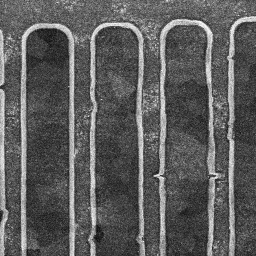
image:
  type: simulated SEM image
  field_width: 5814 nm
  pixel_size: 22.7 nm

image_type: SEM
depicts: one or a few lines or trenches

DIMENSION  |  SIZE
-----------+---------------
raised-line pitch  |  1580 nm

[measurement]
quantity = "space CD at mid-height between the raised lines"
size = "485 nm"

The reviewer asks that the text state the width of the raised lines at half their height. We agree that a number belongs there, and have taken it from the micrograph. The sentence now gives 1100 nm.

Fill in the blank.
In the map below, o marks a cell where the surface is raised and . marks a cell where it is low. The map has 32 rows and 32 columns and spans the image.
................................
................................
..............................oo
....oooo....ooooo....ooooo...ooo
...oooooo...ooooo...oooooo...ooo
...oooooo...oooooo..oooooo...ooo
...oooooo...oooooo..oooooo...ooo
...oooooo...oooooo..oooooo...ooo
...oooooo...oooooo..oooooo...ooo
...oooooo...oooooo..oooooo...ooo
...oooooo...ooooo...oooooo...ooo
...oooooo...ooooo...oooooo...ooo
...oooooo...ooooo...oooooo...ooo
...oooooo...ooooo...oooooo...ooo
...oooooo...ooooo...oooooo...ooo
...oooooo...ooooo...oooooo...ooo
...oooooo...oooooo..oooooo...ooo
...oooooo...oooooo..oooooo...ooo
...oooooo...oooooo..oooooo...ooo
...oooooo...oooooo..oooooo...ooo
...oooooo...oooooo..oooooo...ooo
...oooooo...oooooo..ooooooo..ooo
...oooooo...oooooo..ooooooo..ooo
...oooooo...oooooo..ooooooo..ooo
...oooooo...oooooo..oooooo...ooo
...oooooo...oooooo..oooooo...ooo
o..oooooo...oooooo..oooooo...ooo
o..oooooo...oooooo..oooooo...ooo
...oooooo...oooooo..oooooo...ooo
...oooooo..ooooooo..oooooo...ooo
...oooooo..ooooooo..oooooo...ooo
...oooooo...oooooo..oooooo...ooo